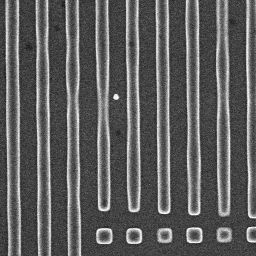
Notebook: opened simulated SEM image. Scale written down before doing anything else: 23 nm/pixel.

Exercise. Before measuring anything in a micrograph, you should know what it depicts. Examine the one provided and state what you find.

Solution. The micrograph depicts groups of lines, slits or small figures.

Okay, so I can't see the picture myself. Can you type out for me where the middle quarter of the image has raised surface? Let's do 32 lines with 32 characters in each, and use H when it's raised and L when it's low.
LHHHLLLLHHHLLLLLHHLLLLLHHHLLLLLH
LHHHLLLLHHHLLLLLHHLLLLLHHHLLLLLH
LHHHLLLLHHHLLLLLHHLLLLLHHHLLLLLH
LHHHLLLLHHHLLLLLHHLLLLLHHHLLLLLH
LHHHLLLLHHHLLLLLHHLLLLLHHHLLLLLH
LHHHLLLLHHHLLLLLHHLLLLLHHHLLLLLH
LHHLLLLLLHHLLLLLHHLLLLLHHHLLLLLH
LHHLLLLLLHHLLLLLHHLLLLLHHHLLLLLH
LHHLLLLLLHHLLLLLHHLLLLLHHHLLLLLH
LHHLLLLLLHHLLLLLHHHLLLLHHHLLLLLH
LHHLLLLLLHHLLLLLHHHLLLLHHHLLLLLH
LHHLLLLLLHHLLLLLHHHLLLLHHHLLLLLH
LHHLLLLLLHHLLLLLHHHLLLLHHHLLLLLH
LHHHLLLLLHHLLLLLHHHLLLLHHHLLLLLH
LHHHLLLLLHHLLLLLHHHLLLLHHHLLLLLH
LHHHLLLLLHHLLLLLHHHLLLLHHHLLLLLH
LHHHLLLLLHHLLLLLHHHLLLLHHHLLLLLH
LHHHLLLLLHHLLLLLHHHLLLLHHHLLLLLH
LHHHLLLLLHHLLLLLHHHLLLLHHHLLLLLH
LHHHLLLLLHHLLLLLHHHLLLLLHHLLLLLH
LHHHLLLLHHHLLLLLHHHLLLLLHHLLLLLH
LHHHLLLLLHHLLLLLHHHLLLLLHHLLLLLH
LHHHLLLLLHHLLLLLHHHLLLLLHHLLLLLH
LHHHLLLLLHHLLLLLHHHLLLLLHHLLLLLH
LHHHLLLLLHHLLLLLHHHLLLLLHHLLLLLH
LHHHLLLLLHHLLLLLHHHLLLLLHHLLLLLH
LHHHLLLLLHHLLLLLHHHLLLLLHHLLLLLH
LHHHLLLLLHHLLLLLHHHLLLLLHHLLLLLH
LHHHLLLLLHHLLLLLHHHLLLLLHHLLLLLH
LHHHLLLLLHHLLLLLHHHLLLLLHHLLLLLH
LHHHLLLLLHHLLLLLHHHLLLLLHHLLLLLH
LHHHLLLLLHHLLLLLHHHLLLLLHHLLLLLH